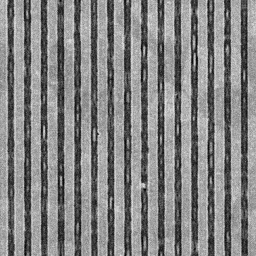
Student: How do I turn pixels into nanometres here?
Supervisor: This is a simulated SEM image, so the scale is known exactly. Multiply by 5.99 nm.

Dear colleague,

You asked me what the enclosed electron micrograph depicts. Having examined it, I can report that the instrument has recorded parallel lines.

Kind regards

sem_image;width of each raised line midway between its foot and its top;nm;53.2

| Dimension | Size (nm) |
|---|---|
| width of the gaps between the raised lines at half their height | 42.7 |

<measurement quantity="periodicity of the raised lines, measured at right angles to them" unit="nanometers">99.9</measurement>